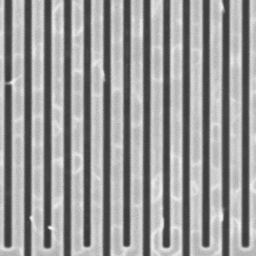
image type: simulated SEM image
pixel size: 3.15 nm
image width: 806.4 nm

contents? parallel lines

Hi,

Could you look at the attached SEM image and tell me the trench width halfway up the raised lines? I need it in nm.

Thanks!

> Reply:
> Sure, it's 22.1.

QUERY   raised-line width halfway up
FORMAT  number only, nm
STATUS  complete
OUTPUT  41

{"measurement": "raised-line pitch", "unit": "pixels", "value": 19.8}